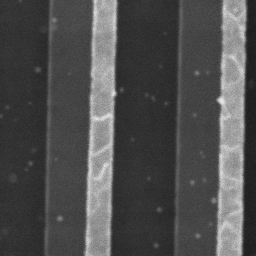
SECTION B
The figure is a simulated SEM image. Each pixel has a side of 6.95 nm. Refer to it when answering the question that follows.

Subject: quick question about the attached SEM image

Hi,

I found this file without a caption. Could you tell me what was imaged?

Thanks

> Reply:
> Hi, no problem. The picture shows lines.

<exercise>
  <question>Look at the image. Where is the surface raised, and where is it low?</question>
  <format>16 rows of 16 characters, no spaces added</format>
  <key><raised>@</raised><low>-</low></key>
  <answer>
---@@@@----@@@@-
---@@@@----@@@@-
---@@@@----@@@@-
---@@@@----@@@@-
---@@@@----@@@@-
---@@@@----@@@@-
---@@@@----@@@@-
---@@@@----@@@@-
---@@@@----@@@@-
---@@@@----@@@@-
---@@@@----@@@@-
---@@@@----@@@@-
---@@@@----@@@@-
---@@@@----@@@@-
---@@@@----@@@@-
---@@@@----@@@@-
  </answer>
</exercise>